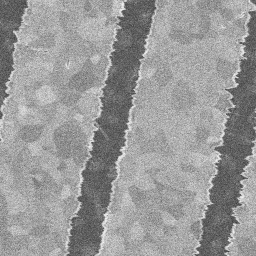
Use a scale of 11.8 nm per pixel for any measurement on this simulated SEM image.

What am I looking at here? one or a few lines or trenches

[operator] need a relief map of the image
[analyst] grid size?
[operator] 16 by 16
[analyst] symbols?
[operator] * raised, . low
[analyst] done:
..******..******
.******...*****.
.******..******.
.******..******.
.******..******.
.*****...*****..
******..******..
******..******..
******..******..
******..******..
*****..******..*
*****..******..*
*****..******..*
*****..******..*
****...******..*
****..******..**